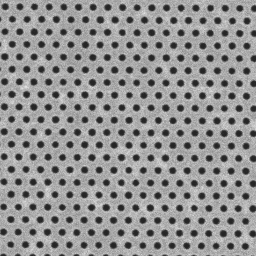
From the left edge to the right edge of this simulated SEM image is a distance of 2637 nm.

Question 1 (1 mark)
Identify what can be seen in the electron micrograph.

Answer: a regular array of holes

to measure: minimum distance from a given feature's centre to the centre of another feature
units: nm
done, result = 147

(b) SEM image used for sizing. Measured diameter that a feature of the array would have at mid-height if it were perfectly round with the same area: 0.0744 microns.